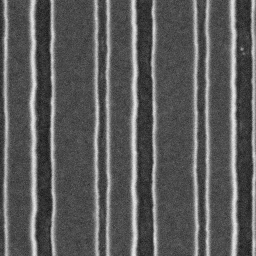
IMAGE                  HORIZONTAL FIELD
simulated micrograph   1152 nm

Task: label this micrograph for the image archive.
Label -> lines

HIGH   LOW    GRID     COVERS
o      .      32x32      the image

oooo..ooooooooooo..oooooooooo...
oooo..ooooooooooo..oooooooooo...
oooo..ooooooooooo..oooooooooo...
oooo..ooooooooooo..oooooooooo...
oooo...oooooooooo..oooooooooo...
oooo..ooooooooooo..oooooooooo...
oooo..ooooooooooo..oooooooooo...
oooo..ooooooooooo..oooooooooo...
oooo..ooooooooooo..oooooooooo...
oooo..ooooooooooo..oooooooooo...
oooo...oooooooooo..oooooooooo...
oooo...oooooooooo..oooooooooo...
oooo..ooooooooooo..oooooooooo...
oooo...oooooooooo..oooooooooo...
oooo..ooooooooooo..oooooooooo...
oooo..ooooooooooo..oooooooooo...
oooo..ooooooooooo..oooooooooo...
oooo..ooooooooooo..oooooooooo...
oooo..ooooooooooo..oooooooooo...
oooo..ooooooooooo..oooooooooo...
oooo...oooooooooo..oooooooooo...
oooo...oooooooooo..oooooooooo...
oooo...oooooooooo..oooooooooo...
oooo...oooooooooo..oooooooooo...
oooo...oooooooooo..oooooooooo...
oooo...oooooooooo..oooooooooo...
oooo...oooooooooo..oooooooooo...
oooo...oooooooooo..oooooooooo...
oooo..ooooooooooo..oooooooooo...
oooo..ooooooooooo..oooooooooo...
oooo...oooooooooo..oooooooooo...
oooo...oooooooooo..oooooooooo...